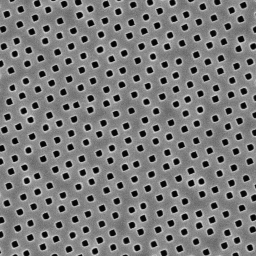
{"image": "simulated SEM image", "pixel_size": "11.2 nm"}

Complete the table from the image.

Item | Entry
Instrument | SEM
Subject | a regular array of holes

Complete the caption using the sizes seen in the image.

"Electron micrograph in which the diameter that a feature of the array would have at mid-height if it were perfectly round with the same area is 0.0744 µm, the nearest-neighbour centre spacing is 13.8 pixels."